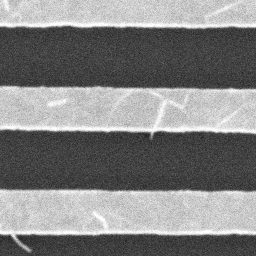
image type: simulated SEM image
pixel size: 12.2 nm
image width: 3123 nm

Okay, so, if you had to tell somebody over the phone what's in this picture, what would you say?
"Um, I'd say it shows lines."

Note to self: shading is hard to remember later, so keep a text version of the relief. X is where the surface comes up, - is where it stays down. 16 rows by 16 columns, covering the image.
XXXXXXXXXXXXXXXX
XXXXXXXXXXXXXXXX
----------------
----------------
----------------
X-X---X---------
XXXXXXXXXXXXXXXX
XXXXXXXXXXXXXXXX
----------------
----------------
----------------
----------------
XXXXXXXXXXXXXXXX
XXXXXXXXXXXXXXXX
XXXXXXXXXXXXXXXX
----------------